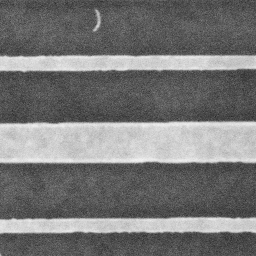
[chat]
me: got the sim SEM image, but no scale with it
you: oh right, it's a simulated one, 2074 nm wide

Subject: lines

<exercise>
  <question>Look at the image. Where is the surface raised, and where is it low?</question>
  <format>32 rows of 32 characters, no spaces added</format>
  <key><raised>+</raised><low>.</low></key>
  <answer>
................................
................................
................................
................................
................................
................................
................................
++++++++++++++++++++++++++++++++
++++++++++++++++++++++++++++++++
................................
................................
................................
................................
................................
................................
.....+.+++++++++++++++++++++++++
++++++++++++++++++++++++++++++++
++++++++++++++++++++++++++++++++
++++++++++++++++++++++++++++++++
++++++++++++++++++++++++++++++++
................................
................................
................................
................................
................................
................................
................................
.+.+++++++++++++++++++++++++++++
++++++++++++++++++++++++++++++++
................................
................................
................................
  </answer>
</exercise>